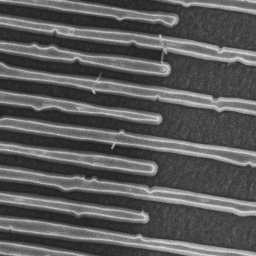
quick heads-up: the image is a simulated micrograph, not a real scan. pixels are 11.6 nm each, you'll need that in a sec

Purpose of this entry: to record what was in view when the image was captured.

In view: parallel lines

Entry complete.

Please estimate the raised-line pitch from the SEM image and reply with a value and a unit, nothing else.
288 nm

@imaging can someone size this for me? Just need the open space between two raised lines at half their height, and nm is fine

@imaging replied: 161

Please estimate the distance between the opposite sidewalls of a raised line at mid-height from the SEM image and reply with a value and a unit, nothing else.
119 nm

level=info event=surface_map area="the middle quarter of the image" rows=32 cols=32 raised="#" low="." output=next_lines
..........################......
...............###########......
......................####......
#####...#.......................
#############...................
..#################.............
.......##################.......
...............#################
......................#.########
###..........................###
#######.........................
##############..................
.......##############...........
..............##########........
................................
#...............................
########........................
###############.................
..###################...........
.........####################...
..................##############
.........................#######
########........................
###############.................
.###################............
.......################.........
..............#########.........
................................
#####...........................
###########.....................
##################..............
##...################.###.......